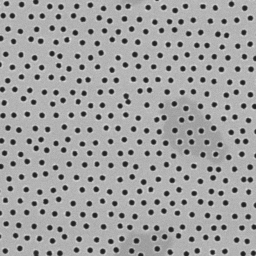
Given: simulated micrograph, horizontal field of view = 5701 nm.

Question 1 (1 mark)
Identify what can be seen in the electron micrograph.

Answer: a regular array of holes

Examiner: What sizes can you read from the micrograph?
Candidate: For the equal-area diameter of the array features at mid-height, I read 131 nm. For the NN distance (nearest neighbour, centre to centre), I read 0.257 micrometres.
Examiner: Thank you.